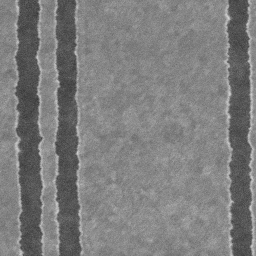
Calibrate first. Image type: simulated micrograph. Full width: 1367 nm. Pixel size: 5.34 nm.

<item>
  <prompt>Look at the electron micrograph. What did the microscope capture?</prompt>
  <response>lines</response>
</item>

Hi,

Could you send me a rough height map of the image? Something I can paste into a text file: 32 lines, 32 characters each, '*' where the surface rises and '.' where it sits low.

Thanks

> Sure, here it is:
**...**...*******************..*
**...**..*******************...*
**...**..*******************...*
**...**...******************...*
**...**...******************...*
**...**...*******************..*
**...**..*******************...*
**...**...******************...*
**...**...*******************..*
**...**...******************...*
**...**...*******************..*
**...**...*******************..*
**...**..********************..*
**...**...******************...*
**...**...*******************..*
**...**...*******************..*
**...**...******************...*
**...**...******************...*
**...**...*******************..*
**...**...*******************..*
**...**...*******************..*
**...**...*******************..*
**...**...*******************..*
***..**...*******************..*
***..**...*******************...
***..**...*******************..*
***..**...*******************..*
**...**...*******************...
***..**...*******************...
***..**...*******************...
***..**...*******************..*
***..**...*******************...